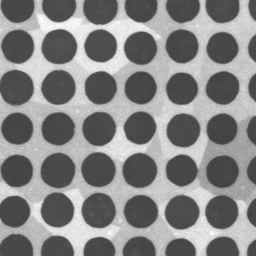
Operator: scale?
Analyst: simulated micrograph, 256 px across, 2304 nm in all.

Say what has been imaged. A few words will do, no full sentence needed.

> a regular array of holes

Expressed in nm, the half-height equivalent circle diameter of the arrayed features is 301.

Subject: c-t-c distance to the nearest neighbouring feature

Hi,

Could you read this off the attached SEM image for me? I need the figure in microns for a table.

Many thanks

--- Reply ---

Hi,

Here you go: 0.362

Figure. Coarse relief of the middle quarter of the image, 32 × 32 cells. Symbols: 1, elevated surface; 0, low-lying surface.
11111111111111111111111111111111
11111111111111111111111111111111
01111110000011111000011111110001
00111100000011110000001111100000
00011000000001100000000111000000
00011000000001100000000110000000
00011000000001100000000110000000
00011000000001100000000111000000
00111100000011110000001111000000
01111110000111111000011111100000
11111111111111111111111111111111
11111111111111111111111111111111
11111110000111111000011111110001
00111000000011110000001111100000
00111000000001100000000111000000
00011000000001100000000111000000
00010000000001100000000111000000
00011000000001100000000111000000
00111000000011110000001111000000
01111100000111111000011111100000
11111111001111111111111111110000
11111111111111111111111111111111
11111110000111111000111111111111
00111000000011110000001111100000
00111000000011100000000111000000
00010000000001100000000111000000
00010000000001000000000110000000
00010000000001100000000111000000
00111000000011100000000111000000
00111100000011100000001111100000
01111110001111111000011111110001
11111111111111111111111111111111